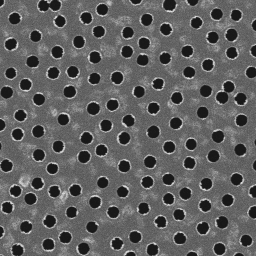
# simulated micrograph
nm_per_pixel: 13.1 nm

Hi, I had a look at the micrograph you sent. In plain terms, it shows a regular array of holes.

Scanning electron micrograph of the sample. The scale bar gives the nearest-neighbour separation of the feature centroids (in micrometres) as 0.268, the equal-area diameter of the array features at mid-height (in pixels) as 11.8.